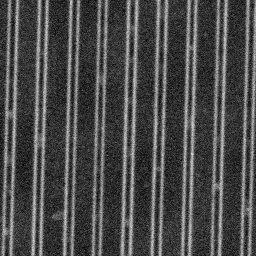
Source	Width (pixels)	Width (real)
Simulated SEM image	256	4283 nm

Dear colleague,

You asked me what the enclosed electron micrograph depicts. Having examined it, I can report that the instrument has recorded parallel lines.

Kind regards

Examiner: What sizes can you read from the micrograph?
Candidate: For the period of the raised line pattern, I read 499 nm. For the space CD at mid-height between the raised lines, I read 366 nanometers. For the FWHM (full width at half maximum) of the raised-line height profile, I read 132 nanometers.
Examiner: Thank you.